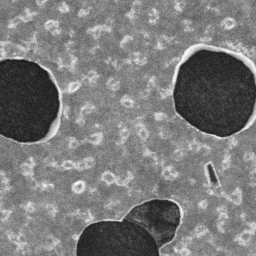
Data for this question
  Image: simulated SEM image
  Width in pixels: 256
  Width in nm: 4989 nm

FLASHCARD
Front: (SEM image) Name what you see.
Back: holes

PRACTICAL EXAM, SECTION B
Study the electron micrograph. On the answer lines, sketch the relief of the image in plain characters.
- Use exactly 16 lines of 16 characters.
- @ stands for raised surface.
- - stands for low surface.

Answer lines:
@@@@@@@@@@@@@@@@
@@@@@@@@@@@@@@@@
@@@@@@@@@@@@@@@@
@@@@@@@@@@@@---@
---@@@@@@@@-----
----@@@@@@@-----
----@@@@@@@-----
----@@@@@@@@----
---@@@@@@@@@@@@@
@@@@@@@@@@@@@@@@
@@@@@@@@@@@@@@@@
@@@@@@@@@@@@@@@@
@@@@@@@@@@@@@@@@
@@@@@@@@---@@@@@
@@@@@------@@@@@
@@@@@-----@@@@@@